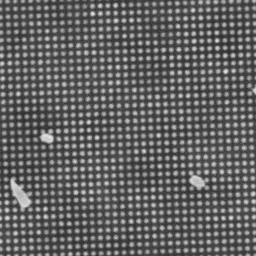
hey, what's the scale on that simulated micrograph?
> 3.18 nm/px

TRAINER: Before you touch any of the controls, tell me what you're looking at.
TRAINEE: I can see a regular array of raised bodies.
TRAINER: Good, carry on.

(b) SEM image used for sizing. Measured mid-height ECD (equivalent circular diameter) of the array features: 13.4 nm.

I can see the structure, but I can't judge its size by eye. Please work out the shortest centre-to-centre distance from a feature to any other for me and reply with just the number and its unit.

23.8 nm